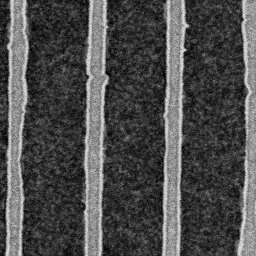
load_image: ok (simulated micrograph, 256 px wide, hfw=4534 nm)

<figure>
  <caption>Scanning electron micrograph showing one or a few lines or trenches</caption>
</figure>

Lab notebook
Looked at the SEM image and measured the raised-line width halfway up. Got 246 nm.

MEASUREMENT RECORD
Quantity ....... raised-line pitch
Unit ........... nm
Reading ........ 1390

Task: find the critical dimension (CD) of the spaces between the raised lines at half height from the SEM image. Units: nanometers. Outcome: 1150